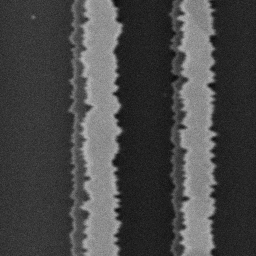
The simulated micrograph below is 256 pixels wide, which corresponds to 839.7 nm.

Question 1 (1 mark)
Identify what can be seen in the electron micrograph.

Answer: lines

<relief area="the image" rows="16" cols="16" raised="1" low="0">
0000011000011000
0000011000011000
0000011000011000
0000011000011000
0000011000011000
0000011000011000
0000011000011000
0000011000011000
0000011000011000
0000011000011000
0000011000011000
0000011000011000
0000011000001000
0000011000011000
0000011000011000
0000011000011000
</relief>